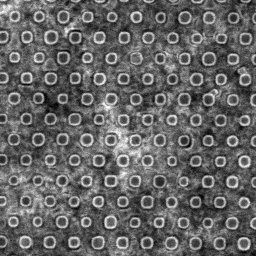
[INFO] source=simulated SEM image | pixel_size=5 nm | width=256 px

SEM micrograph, a regular array of raised bodies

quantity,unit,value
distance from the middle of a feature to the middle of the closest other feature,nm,118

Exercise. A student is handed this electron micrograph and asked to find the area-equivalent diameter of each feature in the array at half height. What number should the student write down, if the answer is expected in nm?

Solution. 54.1